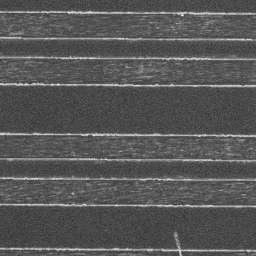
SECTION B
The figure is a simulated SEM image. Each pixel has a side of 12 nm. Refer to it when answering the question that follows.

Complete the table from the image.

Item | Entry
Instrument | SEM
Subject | lines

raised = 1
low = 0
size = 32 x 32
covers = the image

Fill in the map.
11111111111111111111111111111111
11111111111111111111111111111111
00000000000000000000000000000000
00000000000000000000000000000000
00000000000000000000000000000000
11111111111111111111111111111111
11111111111111111111111111111111
00000000000000000000000000000000
00000000000000000000000000000000
00000000000000000000000000000000
11111000000000000000000000000000
11111111111111111111111111111111
11111111111111111111111111111111
11111111111111111111111111111111
11111111111111111111111111111111
11111111111111111111111111111111
11111111111111111111111111111111
00000000000000000000000000000000
00000000000000000000000000000000
00000000000000000000000000000000
11111111111111111111111111111111
11111111111111111111111111111111
00000000000000000000000000000000
00000000000000000000000000000000
00000000000000000000000000000000
00000000000000000000000000000000
11111111111111111111111111111111
11111111111111111111111111111111
11111111111111111111111111111111
11111111111111111111111111111111
11111111111111111111111111111111
00000000000000000000000000000000